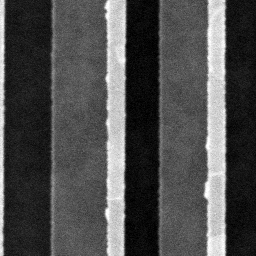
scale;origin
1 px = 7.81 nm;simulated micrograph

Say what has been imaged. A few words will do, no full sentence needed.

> lines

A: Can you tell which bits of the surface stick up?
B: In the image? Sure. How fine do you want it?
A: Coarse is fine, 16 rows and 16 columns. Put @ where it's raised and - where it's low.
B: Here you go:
---@@@@@--@@@@--
---@@@@@--@@@@--
---@@@@@--@@@@--
---@@@@@--@@@@--
---@@@@@--@@@@--
---@@@@@--@@@@--
---@@@@@--@@@@--
---@@@@@--@@@@--
---@@@@@--@@@@--
---@@@@@--@@@@--
---@@@@@--@@@@--
---@@@@@--@@@@--
---@@@@@--@@@@--
---@@@@@--@@@@--
---@@@@@--@@@@--
---@@@@@--@@@@--